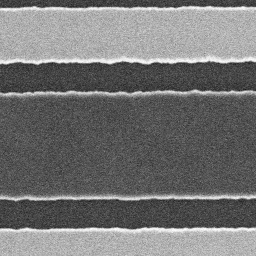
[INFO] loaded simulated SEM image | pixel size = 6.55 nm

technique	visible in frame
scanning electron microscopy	lines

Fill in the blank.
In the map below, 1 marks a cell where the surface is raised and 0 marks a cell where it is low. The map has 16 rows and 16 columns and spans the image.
0111111111111111
1111111111111111
1111111111111111
1111111111111111
0000000000000000
0000000000000000
1111111111111111
1111111111111111
1111111111111111
1111111111111111
1111111111111111
1111111111111111
0000000000000000
0000000000000000
1111111111111111
1111111111111111